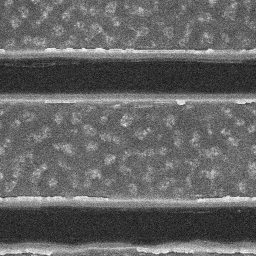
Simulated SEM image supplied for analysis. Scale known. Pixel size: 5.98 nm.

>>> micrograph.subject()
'one or a few lines or trenches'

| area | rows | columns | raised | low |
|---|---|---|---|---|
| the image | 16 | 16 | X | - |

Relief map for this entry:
XXXXXXXXXXXXXXXX
XXXXXXXXXXXXXXXX
XXXXXXXXXXXXXXXX
----------------
----------------
----------------
XXXXXXXXXXXXXXXX
XXXXXXXXXXXXXXXX
XXXXXXXXXXXXXXXX
XXXXXXXXXXXXXXXX
XXXXXXXXXXXXXXXX
XXXXXXXXXXXXXXXX
XXXXXXXXXXXXXXXX
----------------
----------------
XXXXXX-XXXXXXXXX